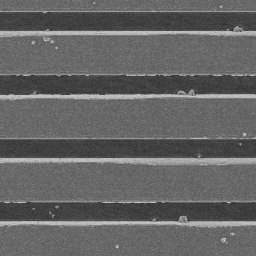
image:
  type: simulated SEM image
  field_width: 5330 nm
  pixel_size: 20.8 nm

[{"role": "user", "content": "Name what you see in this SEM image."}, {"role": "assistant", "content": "lines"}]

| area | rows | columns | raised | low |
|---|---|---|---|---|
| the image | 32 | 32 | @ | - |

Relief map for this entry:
@@@@@@@@@@@@@@@@@@@@@@@@@@@@@@@@
-----@--------------------------
--------------------------------
--------------------------------
@@@@@@@@@@@@@@@@@@@@@@@@@@@@@@@@
@@@@@@@@@@@@@@@@@@@@@@@@@@@@@@@@
@@@@@@@@@@@@@@@@@@@@@@@@@@@@@@@@
@@@@@@@@@@@@@@@@@@@@@@@@@@@@@@@@
@@@@@@@@@@@@@@@@@@@@@@@@@@@@@@@@
--------------------------------
--------------------------------
--------------------------------
@@@@@@@@@@@@@@@@@@@@@@@@@@@@@@@@
@@@@@@@@@@@@@@@@@@@@@@@@@@@@@@@@
@@@@@@@@@@@@@@@@@@@@@@@@@@@@@@@@
@@@@@@@@@@@@@@@@@@@@@@@@@@@@@@@@
@@@@@@@@@@@@@@@@@@@@@@@@@@@@@@@@
--------------------------------
--------------------------------
--------------------------------
@@@@@@@@@@@@@@@@@@@@@@@@@@@@@@@@
@@@@@@@@@@@@@@@@@@@@@@@@@@@@@@@@
@@@@@@@@@@@@@@@@@@@@@@@@@@@@@@@@
@@@@@@@@@@@@@@@@@@@@@@@@@@@@@@@@
@@@@@@@@@@@@@@@@@@@@@@@@@@@@@@@@
--------------------------------
--------------------------------
--------------------------------
@@@@@@@@@@@@@@@@@@@@@@@@@@@@@@@@
@@@@@@@@@@@@@@@@@@@@@@@@@@@@@@@@
@@@@@@@@@@@@@@@@@@@@@@@@@@@@@@@@
@@@@@@@@@@@@@@@@@@@@@@@@@@@@@@@@